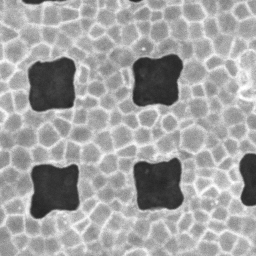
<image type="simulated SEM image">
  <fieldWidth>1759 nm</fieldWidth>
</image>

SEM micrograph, holes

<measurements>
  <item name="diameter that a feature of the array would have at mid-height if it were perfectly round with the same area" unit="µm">0.364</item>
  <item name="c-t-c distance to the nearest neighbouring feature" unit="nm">718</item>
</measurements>